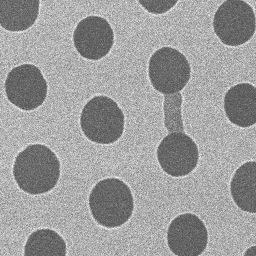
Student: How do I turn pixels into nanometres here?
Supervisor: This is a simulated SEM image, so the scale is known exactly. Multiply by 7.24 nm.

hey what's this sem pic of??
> holes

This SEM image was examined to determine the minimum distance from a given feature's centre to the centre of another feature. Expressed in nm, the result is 594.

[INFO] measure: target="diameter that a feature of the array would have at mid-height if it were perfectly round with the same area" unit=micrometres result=0.335